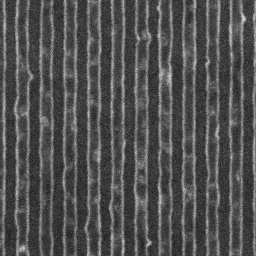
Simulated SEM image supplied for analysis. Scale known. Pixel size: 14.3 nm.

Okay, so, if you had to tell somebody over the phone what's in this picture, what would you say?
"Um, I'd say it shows parallel lines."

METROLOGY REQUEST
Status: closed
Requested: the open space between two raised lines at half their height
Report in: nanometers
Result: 170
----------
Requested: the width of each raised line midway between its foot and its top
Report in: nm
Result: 170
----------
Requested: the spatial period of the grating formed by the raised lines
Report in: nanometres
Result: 340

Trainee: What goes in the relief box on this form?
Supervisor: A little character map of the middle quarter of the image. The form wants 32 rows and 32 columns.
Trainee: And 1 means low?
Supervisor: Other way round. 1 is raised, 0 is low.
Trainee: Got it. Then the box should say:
11100011100011100011100011000011
11100011100011100011100011100011
11100011100011100011100011100011
11100011100011100011100011100011
11100011100011100011100011100011
11100011100011100011100011100011
11100011100011100011100011100011
11100011100011100011100011100011
11100011100011100011100011100011
11100011100011100011100011100011
11100011100011100011100011100011
11100011100011100011100011100011
11100011100011100011100011100011
11100011100011100011100011100011
11100011100011100011100011100011
11100011100011100011100011100011
11100011100011100011100011100011
11100011100011100011100011100011
11100011100011100011100011100011
11100011100011100011100011100011
11100011100011100011100011100011
11100011100011100011100011100011
11100011100011100011100011100011
11100011100011100011000011100011
11100011100011100011100011100011
11100011100011100011100011100011
11100011100011100011100011100011
11100011100011100011100011100011
11100011100011100011100011100011
11100011100011100011100011100011
11100011100011100011100011100011
11100011100011100011100011100011